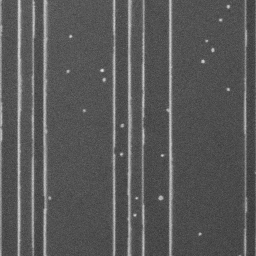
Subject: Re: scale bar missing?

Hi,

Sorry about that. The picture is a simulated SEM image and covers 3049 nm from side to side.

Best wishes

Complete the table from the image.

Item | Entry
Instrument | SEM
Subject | lines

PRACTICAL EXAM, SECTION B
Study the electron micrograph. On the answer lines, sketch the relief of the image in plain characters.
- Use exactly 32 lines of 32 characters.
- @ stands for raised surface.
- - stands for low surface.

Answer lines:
--@@--@@@@@@@@--@@---@@@@@@@@@@-
--@@--@@@@@@@@--@@---@@@@@@@@@@-
--@@--@@@@@@@@--@@---@@@@@@@@@@-
--@@--@@@@@@@@--@@---@@@@@@@@@@-
--@@--@@@@@@@@--@@---@@@@@@@@@@-
--@@--@@@@@@@@--@@---@@@@@@@@@@-
--@@--@@@@@@@@--@@---@@@@@@@@@@-
--@@--@@@@@@@@--@@---@@@@@@@@@@-
--@@--@@@@@@@@--@@---@@@@@@@@@@-
--@@--@@@@@@@@--@@---@@@@@@@@@@-
--@@--@@@@@@@@--@@---@@@@@@@@@@-
--@@--@@@@@@@@--@@---@@@@@@@@@@-
--@@--@@@@@@@@--@@---@@@@@@@@@@-
--@@--@@@@@@@@--@@---@@@@@@@@@@-
--@@--@@@@@@@@--@@---@@@@@@@@@@-
--@@--@@@@@@@@--@@---@@@@@@@@@@-
--@@--@@@@@@@@--@@---@@@@@@@@@@-
--@@--@@@@@@@@--@@---@@@@@@@@@@-
--@@--@@@@@@@@--@@---@@@@@@@@@@-
--@@--@@@@@@@@--@@---@@@@@@@@@@-
--@@--@@@@@@@@--@@---@@@@@@@@@@-
--@@--@@@@@@@@--@@---@@@@@@@@@@-
--@@--@@@@@@@@--@@---@@@@@@@@@@-
--@@--@@@@@@@@--@@---@@@@@@@@@@-
--@@--@@@@@@@@--@@---@@@@@@@@@@-
--@@--@@@@@@@@--@@---@@@@@@@@@@-
--@@--@@@@@@@@--@@---@@@@@@@@@@-
--@@--@@@@@@@@--@@---@@@@@@@@@@-
--@@--@@@@@@@@--@@---@@@@@@@@@@-
--@@--@@@@@@@@--@@---@@@@@@@@@@-
--@@--@@@@@@@@--@@---@@@@@@@@@@-
--@@--@@@@@@@@--@@---@@@@@@@@@@-